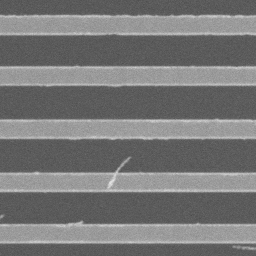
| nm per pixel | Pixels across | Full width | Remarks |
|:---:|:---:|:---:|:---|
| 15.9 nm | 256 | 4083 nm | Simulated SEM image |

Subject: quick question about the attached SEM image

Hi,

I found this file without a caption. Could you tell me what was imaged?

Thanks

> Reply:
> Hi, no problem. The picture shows lines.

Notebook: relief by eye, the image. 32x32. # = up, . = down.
................................
................................
################################
################################
................................
................................
................................
................................
################################
################################
################################
................................
................................
................................
................................
################################
################################
................................
................................
................................
................................
................................
################################
################################
................................
................................
................................
................................
################################
################################
................................
................................